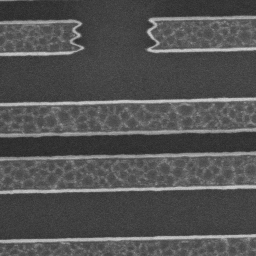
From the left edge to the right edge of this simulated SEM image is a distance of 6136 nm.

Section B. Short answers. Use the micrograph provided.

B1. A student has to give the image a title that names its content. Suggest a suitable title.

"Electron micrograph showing one or a few lines or trenches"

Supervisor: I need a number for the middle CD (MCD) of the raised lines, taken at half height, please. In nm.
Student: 755